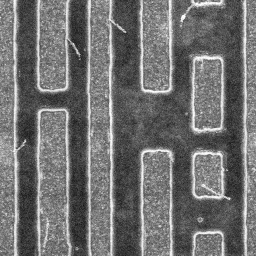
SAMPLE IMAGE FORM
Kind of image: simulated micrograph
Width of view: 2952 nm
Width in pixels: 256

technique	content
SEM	parallel lines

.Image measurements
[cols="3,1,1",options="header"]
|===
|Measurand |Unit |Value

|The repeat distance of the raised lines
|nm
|591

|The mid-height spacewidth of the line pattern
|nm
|265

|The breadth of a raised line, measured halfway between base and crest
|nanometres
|321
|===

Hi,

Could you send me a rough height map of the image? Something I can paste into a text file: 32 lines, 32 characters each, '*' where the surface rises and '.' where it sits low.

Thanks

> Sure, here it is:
**...***...***....***....*.....*
**...***...***....***..........*
**...***...***....***..........*
**...***...***....***..........*
**...***...***....***..........*
**...***...***....***..........*
**...***...***....***..........*
**...***...***....***...****...*
**...***...***....***...****...*
**...***...***....***...****...*
**...***...***....***...****...*
**.........***..........****...*
**.........***..........****...*
**.........***..........****...*
**...***...***..........****...*
**...***...***..........****...*
**...***...***.................*
**...***...***.................*
**...***...***.................*
**...***...***....***...***....*
**...***...***....***...****...*
**...***...***....***...****...*
**...***...***....***...****...*
**...***...***....***...****...*
**...***...***....***....***...*
**...***...***....***..........*
**...***...***....***..........*
**...***...***....***..........*
**...***...***....***..........*
**...***...***....***....***...*
**...****..***....***...****...*
**...****..***....***...****...*